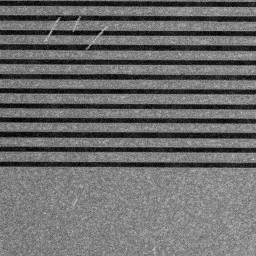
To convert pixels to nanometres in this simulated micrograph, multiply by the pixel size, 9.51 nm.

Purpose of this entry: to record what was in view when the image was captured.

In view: parallel lines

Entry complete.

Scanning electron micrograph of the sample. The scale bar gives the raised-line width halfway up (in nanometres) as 84.4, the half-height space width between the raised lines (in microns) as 0.0511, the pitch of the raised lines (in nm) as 139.